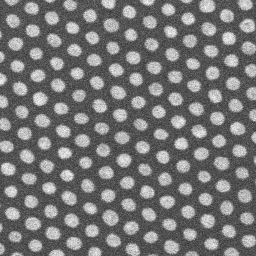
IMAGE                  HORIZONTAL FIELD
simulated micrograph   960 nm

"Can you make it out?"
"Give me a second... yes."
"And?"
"a regular array of raised bodies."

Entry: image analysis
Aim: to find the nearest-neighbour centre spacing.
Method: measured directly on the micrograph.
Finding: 82.1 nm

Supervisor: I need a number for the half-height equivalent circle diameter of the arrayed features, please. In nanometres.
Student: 47.4